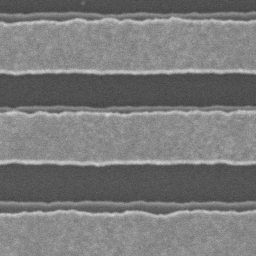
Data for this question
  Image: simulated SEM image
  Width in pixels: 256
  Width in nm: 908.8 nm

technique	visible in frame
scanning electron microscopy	lines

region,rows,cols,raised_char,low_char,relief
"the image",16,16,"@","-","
----------------
@@@@@@@@@@@@@@@@
@@@@@@@@@@@@@@@@
@@@@@@@@@@@@@@@@
@@@@@@@@@@@@@@@@
----------------
----------------
@@@@@@@@@@@@@@@@
@@@@@@@@@@@@@@@@
@@@@@@@@@@@@@@@@
----------------
----------------
----------------
@@@@@@@@@@@@@@@@
@@@@@@@@@@@@@@@@
@@@@@@@@@@@@@@@@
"